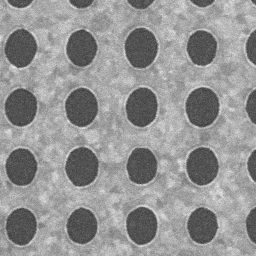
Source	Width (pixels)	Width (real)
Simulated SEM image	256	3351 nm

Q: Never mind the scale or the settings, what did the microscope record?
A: a regular array of holes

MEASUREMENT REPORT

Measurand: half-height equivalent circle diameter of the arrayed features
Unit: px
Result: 36.2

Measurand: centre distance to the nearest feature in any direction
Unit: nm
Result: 775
